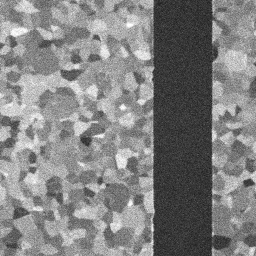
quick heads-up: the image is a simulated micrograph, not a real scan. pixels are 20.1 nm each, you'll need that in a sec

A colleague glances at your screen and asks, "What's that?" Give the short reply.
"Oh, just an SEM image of one or a few lines or trenches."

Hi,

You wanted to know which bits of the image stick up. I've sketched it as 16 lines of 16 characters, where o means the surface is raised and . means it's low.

oooooooooo...ooo
oooooooooo...ooo
oooooooooo...ooo
oooooooooo...ooo
oooooooooo...ooo
oooooooooo...ooo
oooooooooo...ooo
oooooooooo...ooo
oooooooooo...ooo
oooooooooo...ooo
oooooooooo...ooo
oooooooooo...ooo
oooooooooo...ooo
oooooooooo...ooo
oooooooooo...ooo
oooooooooo...ooo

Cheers